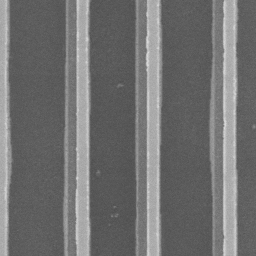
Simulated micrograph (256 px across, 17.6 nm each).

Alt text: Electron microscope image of lines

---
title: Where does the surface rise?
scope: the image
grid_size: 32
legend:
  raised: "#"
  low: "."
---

#.......###......###.......##...
#.......###......###.......##...
#.......###......###.......##...
#.......###......###.......##...
#.......###......###.......##...
#.......###......###.......##...
#.......###......###.......##...
#.......###......###.......##...
#.......###......###.......##...
#.......###......###.......##...
#.......###......###.......##...
#.......###......###.......##...
#.......###......###.......##...
#.......###......###.......##...
#.......###......###.......##...
#.......###......###.......##...
#.......###......###.......##...
#.......###......###.......##...
#.......###......###.......##...
#.......###......###.......##...
#.......###......###.......##...
#.......###......###.......##...
#.......###......###.......##...
#.......###......###.......##...
#.......###......###.......##...
#.......###......###.......##...
#.......###......###.......##...
#.......###......###.......##...
#.......###......###.......##...
#.......###......###.......##...
#.......###......###.......##...
#.......###......###.......##...